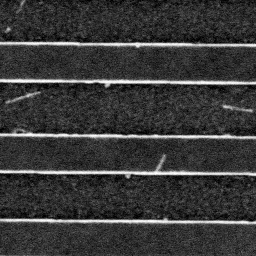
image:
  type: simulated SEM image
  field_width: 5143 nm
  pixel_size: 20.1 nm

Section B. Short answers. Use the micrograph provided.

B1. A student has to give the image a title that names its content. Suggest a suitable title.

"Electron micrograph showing lines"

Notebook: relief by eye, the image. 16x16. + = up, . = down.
................
................
................
++++++++++++++++
++++++++++++++++
................
................
................
++++++++........
++++++++++++++++
++++++++++++++++
................
................
................
++++++++++++++++
++++++++++++++++